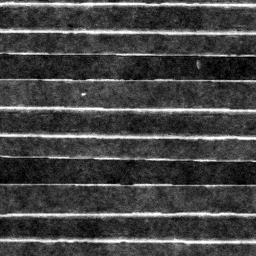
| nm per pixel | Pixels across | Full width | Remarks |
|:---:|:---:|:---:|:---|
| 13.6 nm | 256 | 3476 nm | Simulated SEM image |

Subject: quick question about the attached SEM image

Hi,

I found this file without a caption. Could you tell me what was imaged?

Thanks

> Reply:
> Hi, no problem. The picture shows lines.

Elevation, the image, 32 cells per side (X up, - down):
--------X-----------------XXXXXX
--------------------------------
--------------------------------
--------------------------------
XXXXXXXXXXXXXXXXXXXXXXXXXXXXXXXX
XXXXXXXXXXXXXXXXXXXXXXXXXXXXXXXX
XXXXXXXXXXXXXXXXXXXXXXXXXXXXXXXX
--------------------------------
--------------------------------
--------------------------------
XXXXXXXXXXXXXXXXXXXXXXXXXXXXXXXX
XXXXXXXXXXXXXXXXXXXXXXXXXXXXXXXX
XXXXXXXXXXXXXXXXXXXXXXXXXXXXXXXX
---------XXXXXXXXXXXXXXXXXXXXXXX
--------------------------------
--------------------------------
--------------------------------
XXXXXXXXXXXXXXXXXXXXXXXXXXXXXXXX
XXXXXXXXXXXXXXXXXXXXXXXXXXXXXXXX
XXXXXXXXXXXXXXXXXXXXXXXXXXXXXXXX
--------------------------------
--------------------------------
--------------------------------
XXXXXXXXXXXXXXXXXXXXXXXXXXXXXXXX
XXXXXXXXXXXXXXXXXXXXXXXXXXXXXXXX
XXXXXXXXXXXXXXXXXXXXXXXXXXXXXXXX
XXXXXXXXXXXXXXXXXXXXXXXXXXXXXXXX
--------------------------------
--------------------------------
--------------------------------
XXXXXXXXXXXXXXXXXXXXXXXXXXXXXXXX
XXXXXXXXXXXXXXXXXXXXXXXXXXXXXXXX